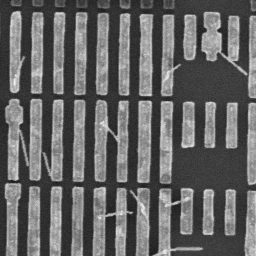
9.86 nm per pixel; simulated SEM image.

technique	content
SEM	wiring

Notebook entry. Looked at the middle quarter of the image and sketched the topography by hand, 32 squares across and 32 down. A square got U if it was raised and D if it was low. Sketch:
DDDUUDDDUUUDDDUUDDDUUUDDDUUDDDDD
DDDUUDDDUUUDDDUUDDDUUUDDDUUUDDDD
DDDUUDDDUUUDDDUUDDDUUUDDDUUDDDDD
DDDUUDDDUUUDDDUUDDDUUUDDDUUDDDDD
DDDUUDDDUUUDDDUUDDDUUUDDDUUDDDDD
DDDUUDDDUUUDDDUUDDDUUUDDDUUDDDDD
DDDUUDDDUUUDDDUUDDDUUUDDUUUDDDDD
DDDUUDDDDUDDDDUUDDDUUUDDUUUDDDDD
DDDDDDDDDDDDDDDDDDDDDDDDDDDDDDDD
DDDUUDDDUUDDDDUUDDDUUDDDDDDDDDDD
DDDUUDDDUUUDDDUUDDDUUUDDUUUDDDUU
DDDUUDDDUUUDDDUUDDDUUUDDUUUDDDUU
DDDUUDDDUUUDDDUUDDDUUUDDUUUDDDUU
DDDUUDDDUUUDDDUUDDDUUUDDUUUDDDUU
DDDUUDDDUUUDDDUUDDDUUDDDUUUDDDUU
DDDUUDDDUUUDDDUUDDDUUDDDUUUDDDUU
DDDUUDDDUUUDDDUUDDDUUDDDUUUDDDUU
DDDUUDDDUUUDDUUUDDDUUDDDUUUDDDUU
DDDUUDDDUUUDDUUUDDDUUDDDUUUDDDUU
DDUUUDDDUUUDDUUUDDDUUDDDUUUDDUUU
DDUUUDDDUUDDDDUUDDDUUDDDUUUDDUUU
DDUUUDDDUUDDDDUUDDDUUDDDUUUDDDDD
DDUUUDDDUUDDDUUUDDDUUDDDUUUDDDDD
DDUUUDDDUUDDDUUUDDDUUDDDUUUDDDDD
DDUUUDDDUUDDDUUUDDDUUDDDUUUDDDDD
DDUUUDDDUUDDDUUUDDDUUDDDUUUDDDDD
DDUUUDDDUUDDDUUUDDDUUDDDUUUDDDDD
DDUUUDDDUUDDDUUUDDDUUDDDUUUDDDDD
DDUUUDDDUUDDDUUUDDDUUDDDUUUDDDDD
DDDDDDDDDDDDDDDDDDDUUDDDUUUDDDDD
DDDDDDDDDDDDDDDDDDDDDDDDDDDDDDDD
DDUUUDDDUUDDDUUDDDDUUDDDUUUDDUUU